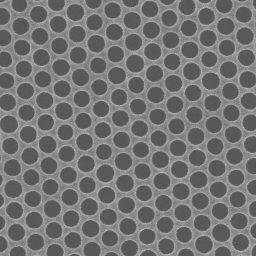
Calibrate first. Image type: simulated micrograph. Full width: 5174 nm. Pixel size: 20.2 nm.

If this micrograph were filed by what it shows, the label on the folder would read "a regular array of holes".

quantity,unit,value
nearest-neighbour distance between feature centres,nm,428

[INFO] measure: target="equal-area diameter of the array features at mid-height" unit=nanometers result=335